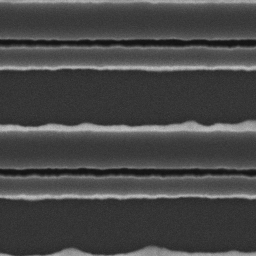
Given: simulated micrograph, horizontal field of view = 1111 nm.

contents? lines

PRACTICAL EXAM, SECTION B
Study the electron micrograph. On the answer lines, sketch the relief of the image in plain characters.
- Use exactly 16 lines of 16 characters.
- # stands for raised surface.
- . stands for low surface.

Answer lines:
################
################
################
################
................
................
................
................
################
################
################
################
................
................
................
................